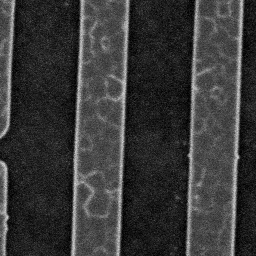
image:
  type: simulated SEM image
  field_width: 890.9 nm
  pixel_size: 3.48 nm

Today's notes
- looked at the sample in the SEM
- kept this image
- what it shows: one or a few lines or trenches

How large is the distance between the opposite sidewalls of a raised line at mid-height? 46.1 px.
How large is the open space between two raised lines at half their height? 236 nanometres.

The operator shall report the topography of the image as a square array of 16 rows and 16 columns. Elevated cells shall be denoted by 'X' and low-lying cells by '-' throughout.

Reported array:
X----XXX----XXX-
X----XXX----XXX-
X----XXX----XXX-
X----XXX----XXX-
X----XXX----XXX-
X----XXX----XXX-
X----XXX----XXX-
X----XXX----XXX-
-----XXX----XXX-
-----XXX----XXX-
-----XXX----XXX-
-----XXX----XXX-
-----XXX----XXX-
-----XXX----XXX-
-----XX-----XXX-
-----XX-----XXX-